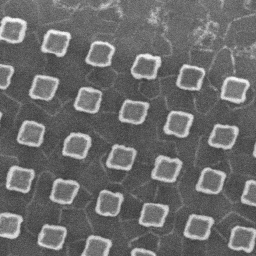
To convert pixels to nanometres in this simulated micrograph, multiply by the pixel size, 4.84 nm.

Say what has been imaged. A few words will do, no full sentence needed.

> a regular array of raised bodies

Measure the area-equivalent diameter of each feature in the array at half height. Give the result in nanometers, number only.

119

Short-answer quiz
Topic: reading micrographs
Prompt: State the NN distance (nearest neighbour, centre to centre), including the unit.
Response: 0.223 micrometres